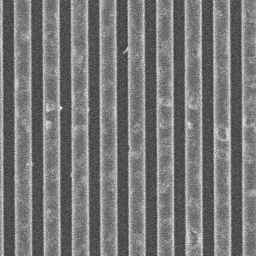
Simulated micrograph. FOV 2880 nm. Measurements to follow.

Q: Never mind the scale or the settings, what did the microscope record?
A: parallel lines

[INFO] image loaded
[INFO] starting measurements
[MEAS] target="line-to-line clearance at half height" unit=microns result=0.135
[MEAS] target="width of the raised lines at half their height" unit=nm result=178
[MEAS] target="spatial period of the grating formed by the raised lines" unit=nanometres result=320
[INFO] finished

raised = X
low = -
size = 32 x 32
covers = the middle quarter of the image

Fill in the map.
--XXXX---XXXX---XXXX---XXXX----X
--XXXX---XXXX---XXXX---XXXX----X
--XXXX---XXXX---XXXX---XXXX---XX
--XXXX---XXXX---XXXX---XXXX---XX
--XXXX---XXXX---XXXX---XXXX---XX
--XXXX---XXXX---XXXX---XXXX----X
--XXXX---XXXX---XXXX---XXXX----X
--XXXX---XXXX---XXXX---XXXX----X
--XXXX---XXXX---XXXX---XXXX----X
--XXXX---XXXX---XXXX---XXXX----X
--XXXX---XXXX---XXXX---XXXX----X
--XXXX---XXXX---XXXX---XXXX----X
--XXXX---XXXX---XXXX---XXXX----X
--XXXX---XXXX---XXXX---XXXX----X
--XXXX---XXXX---XXXX---XXXX----X
--XXXX---XXXX---XXXX---XXXX----X
--XXXX---XXXX---XXXX---XXXX----X
--XXXX---XXXX---XXXX---XXXX----X
--XXXX---XXXX---XXXX---XXXX----X
--XXXX---XXXX---XXXX---XXXX----X
--XXXX---XXXX---XXXX---XXXX----X
--XXXX---XXXX---XXXX---XXXX----X
--XXXX---XXXX---XXXX---XXXX----X
--XXXX---XXXX---XXXX---XXXX----X
--XXXX---XXXX---XXXX---XXXX----X
--XXXX---XXXX---XXXX---XXXX----X
--XXXX---XXXX---XXXX---XXXX----X
--XXXX---XXXX---XXXX---XXXX----X
--XXXX---XXXX---XXXX---XXXX----X
--XXXX---XXXX---XXXX---XXXX----X
--XXXX---XXXX---XXXX---XXXX----X
--XXXX---XXXX---XXXX---XXXX----X